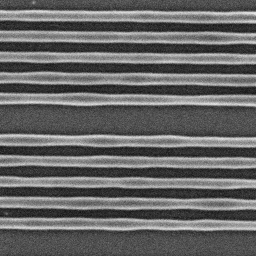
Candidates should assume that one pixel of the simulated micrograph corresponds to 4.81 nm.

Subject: wiring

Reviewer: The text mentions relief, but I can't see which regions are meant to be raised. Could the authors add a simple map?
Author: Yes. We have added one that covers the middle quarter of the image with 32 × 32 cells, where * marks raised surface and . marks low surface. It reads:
................................
................................
***********************.........
********************************
********************************
................................
................................
********........................
********************************
********************************
................................
................................
................................
................................
................................
................................
................................
................................
********************************
********************************
.......*******...**************.
................................
................................
********************************
********************************
...*****************************
................................
................................
***********...*******...........
********************************
********************************
................................